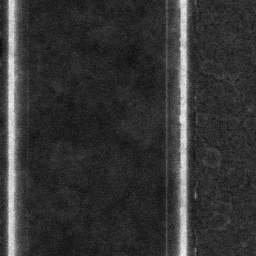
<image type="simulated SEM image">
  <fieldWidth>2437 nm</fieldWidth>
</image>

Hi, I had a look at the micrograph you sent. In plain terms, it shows one or a few lines or trenches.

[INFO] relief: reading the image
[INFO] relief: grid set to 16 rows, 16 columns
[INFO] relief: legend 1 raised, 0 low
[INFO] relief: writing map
0111111111100000
0111111111100000
0111111111100000
0111111111100000
0111111111100000
0111111111100000
0111111111100000
0111111111100000
0111111111100000
0111111111100000
0111111111100000
0111111111100000
0111111111100000
0111111111100000
0111111111100000
0111111111100000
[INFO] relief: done